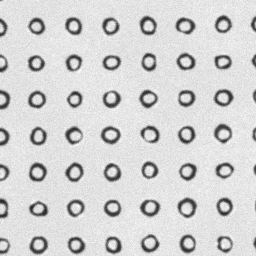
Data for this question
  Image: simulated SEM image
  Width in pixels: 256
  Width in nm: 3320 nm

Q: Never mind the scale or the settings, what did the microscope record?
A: a regular array of ring-shaped grooves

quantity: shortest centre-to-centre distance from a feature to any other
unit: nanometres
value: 465